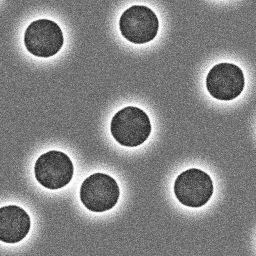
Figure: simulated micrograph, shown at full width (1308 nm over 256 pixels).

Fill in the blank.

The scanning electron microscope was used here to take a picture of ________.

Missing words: holes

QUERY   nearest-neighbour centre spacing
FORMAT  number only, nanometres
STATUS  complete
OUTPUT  448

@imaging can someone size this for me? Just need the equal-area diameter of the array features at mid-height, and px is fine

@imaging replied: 39.8